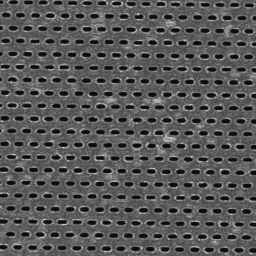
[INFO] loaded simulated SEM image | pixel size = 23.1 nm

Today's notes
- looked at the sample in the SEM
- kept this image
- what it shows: a regular array of holes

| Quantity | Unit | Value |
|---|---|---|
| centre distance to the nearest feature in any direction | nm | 333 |